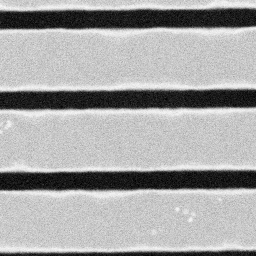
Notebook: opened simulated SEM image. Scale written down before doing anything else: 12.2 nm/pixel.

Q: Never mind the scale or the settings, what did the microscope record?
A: lines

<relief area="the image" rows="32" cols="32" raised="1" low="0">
11111111111111111111111111111111
00000000000000000000000000000000
00000000000000000000000000000000
00000000000000000001110110111111
11111111111111111111111111111111
11111111111111111111111111111111
11111111111111111111111111111111
11111111111111111111111111111111
11111111111111111111111111111111
11111111111111111111111111111111
11111111111111111111111111111111
00000000000000000000000000000000
00000000000000000000000000000000
00000000000000000000000000000000
11111111111111111111111111111111
11111111111111111111111111111111
11111111111111111111111111111111
11111111111111111111111111111111
11111111111111111111111111111111
11111111111111111111111111111111
11111111111111111111111111111111
11111111010000000000000000000000
00000000000000000000000000000000
00000000000000000000000000000000
11111111111111111111111111111111
11111111111111111111111111111111
11111111111111111111111111111111
11111111111111111111111111111111
11111111111111111111111111111111
11111111111111111111111111111111
11111111111111111111111111111111
11111111111101000000000000000000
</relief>